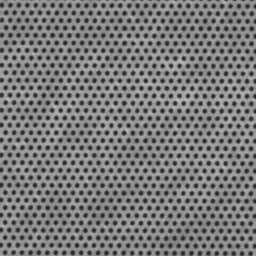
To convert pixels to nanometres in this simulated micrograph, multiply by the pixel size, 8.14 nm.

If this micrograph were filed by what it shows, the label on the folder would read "a regular array of holes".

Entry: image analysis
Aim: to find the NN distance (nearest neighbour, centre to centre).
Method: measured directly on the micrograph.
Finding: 66.8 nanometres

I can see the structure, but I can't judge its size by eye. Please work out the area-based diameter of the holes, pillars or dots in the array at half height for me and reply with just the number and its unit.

0.0411 um